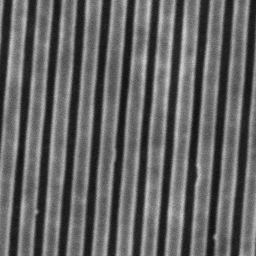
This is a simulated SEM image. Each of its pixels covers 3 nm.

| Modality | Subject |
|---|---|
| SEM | parallel lines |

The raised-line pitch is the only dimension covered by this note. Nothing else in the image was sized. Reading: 0.0738 microns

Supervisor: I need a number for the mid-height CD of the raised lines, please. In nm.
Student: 44.5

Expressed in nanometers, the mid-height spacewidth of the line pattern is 27.7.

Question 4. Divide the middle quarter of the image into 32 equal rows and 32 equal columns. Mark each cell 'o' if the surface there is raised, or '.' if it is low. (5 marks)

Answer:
oo...ooo..oooo...ooo...oooo..ooo
oo..oooo..oooo...ooo...ooo...ooo
oo..oooo..oooo...ooo...ooo...ooo
oo..oooo..oooo..oooo...ooo...ooo
oo..oooo..oooo..oooo...ooo...ooo
oo..oooo..oooo..oooo...ooo...ooo
o...ooo...oooo..oooo...ooo...ooo
o...ooo...oooo..oooo..oooo...ooo
o...ooo...oooo..oooo..oooo...ooo
o...ooo...oooo..oooo..oooo...ooo
o...ooo...oooo..oooo..oooo..oooo
o...ooo...ooo...oooo..oooo..oooo
o...ooo...ooo...oooo..oooo..oooo
o...ooo...ooo...ooo...ooo...oooo
o...ooo...ooo...ooo...ooo...oooo
o...ooo...ooo...ooo...ooo...oooo
o..oooo..oooo..oooo...ooo...oooo
o..oooo..oooo..oooo..oooo...ooo.
o..oooo..oooo..oooo..oooo...ooo.
...ooo...oooo..oooo..oooo...ooo.
...oooo..oooo..oooo..oooo...ooo.
...oooo..oooo..oooo..oooo...ooo.
...ooo...oooo..oooo..oooo...ooo.
...ooo...oooo..oooo..oooo..oooo.
...ooo...ooo...oooo..oooo..oooo.
...ooo...ooo...oooo..oooo..oooo.
..oooo...ooo...ooo...ooo...oooo.
..oooo...ooo...ooo...ooo...oooo.
..oooo...ooo...ooo...ooo...oooo.
..oooo..oooo..oooo...ooo...oooo.
..oooo..oooo..oooo...ooo...ooo..
..oooo..oooo..oooo...ooo...ooo..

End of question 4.